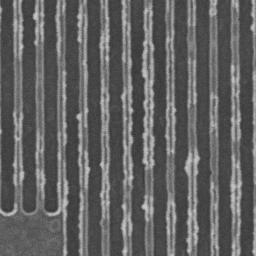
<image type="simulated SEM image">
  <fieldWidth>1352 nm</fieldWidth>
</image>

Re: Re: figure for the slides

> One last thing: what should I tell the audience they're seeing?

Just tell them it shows parallel lines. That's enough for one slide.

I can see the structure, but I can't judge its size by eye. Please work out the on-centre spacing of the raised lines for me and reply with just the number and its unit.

115 nm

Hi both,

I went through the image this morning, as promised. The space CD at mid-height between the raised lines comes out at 0.072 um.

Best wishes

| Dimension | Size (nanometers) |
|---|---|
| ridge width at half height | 40.9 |